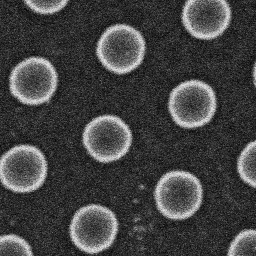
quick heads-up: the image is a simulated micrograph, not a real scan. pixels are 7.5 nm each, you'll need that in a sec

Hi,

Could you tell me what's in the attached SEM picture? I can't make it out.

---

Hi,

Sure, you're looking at raised bodies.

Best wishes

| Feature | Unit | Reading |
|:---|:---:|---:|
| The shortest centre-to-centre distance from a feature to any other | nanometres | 681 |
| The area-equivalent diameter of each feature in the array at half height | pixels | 44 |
